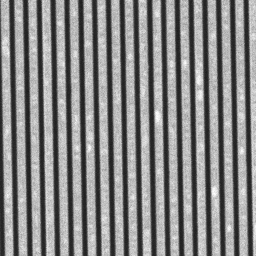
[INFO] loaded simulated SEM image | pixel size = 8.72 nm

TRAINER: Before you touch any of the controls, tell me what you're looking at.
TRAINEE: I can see parallel lines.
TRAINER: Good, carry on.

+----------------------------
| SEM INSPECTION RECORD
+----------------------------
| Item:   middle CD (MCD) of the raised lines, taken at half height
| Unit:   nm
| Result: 76.3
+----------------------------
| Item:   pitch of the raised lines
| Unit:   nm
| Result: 120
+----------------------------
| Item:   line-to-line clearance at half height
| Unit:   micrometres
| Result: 0.0458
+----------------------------